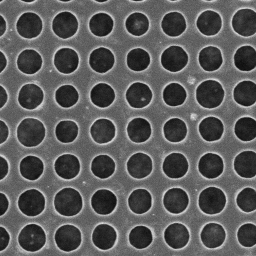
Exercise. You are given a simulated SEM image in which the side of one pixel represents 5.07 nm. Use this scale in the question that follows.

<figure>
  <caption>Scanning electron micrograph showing a regular array of holes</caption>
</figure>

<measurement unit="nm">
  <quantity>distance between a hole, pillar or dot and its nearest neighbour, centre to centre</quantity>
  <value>179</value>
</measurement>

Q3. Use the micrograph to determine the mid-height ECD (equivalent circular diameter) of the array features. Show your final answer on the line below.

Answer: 130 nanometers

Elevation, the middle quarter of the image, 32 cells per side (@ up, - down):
---@@@@-----@@@@-----@@@@-----@@
---@@@@----@@@@@@---@@@@@@---@@@
-@@@@@@@@@@@@@@@@@@@@@@@@@@@@@@@
@@@@@@@@@@@@@@@@@@@@@@@@@@@@@@@@
@@@@@@@@@@@@@@@@@@@@@@@@@@@@@@@@
--@@@@@@---@@@@@-----@@@@@----@@
---@@@@-----@@@@------@@@-----@@
----@@-------@@-------@@@------@
----@@-------@@-------@@@-----@@
---@@@@-----@@@@------@@@-----@@
--@@@@@@---@@@@@@----@@@@@---@@@
@@@@@@@@@@@@@@@@@@@@@@@@@@@@@@@@
@@@@@@@@@@@@@@@@@@@@@@@@@@@@@@@@
@@@@@@@@@-@@@@@@@@--@@@@@@@-@@@@
---@@@@@----@@@@-----@@@@@----@@
---@@@@------@@@------@@@------@
----@@-------@@@------@@@------@
----@@@------@@@------@@@------@
---@@@@-----@@@@-----@@@@-----@@
--@@@@@@---@@@@@@@--@@@@@@@--@@@
@@@@@@@@@@@@@@@@@@@@@@@@@@@@@@@@
@@@@@@@@@@@@@@@@@@@@@@@@@@@@@@@@
-@@@@@@@@@@@@@@@@---@@@@@@----@@
---@@@@@----@@@@------@@@-----@@
----@@@------@@@------@@@------@
----@@@------@@@------@@@------@
----@@@------@@@------@@@------@
----@@@-----@@@@-----@@@@-----@@
--@@@@@@@--@@@@@@@--@@@@@@@--@@@
@@@@@@@@@@@@@@@@@@@@@@@@@@@@@@@@
@@@@@@@@@@@@@@@@@@@@@@@@@@@@@@@@
---@@@@@@--@@@@@@@---@@@@@----@@